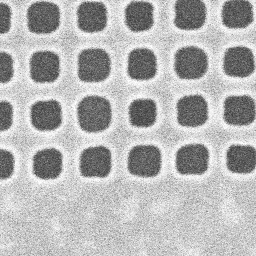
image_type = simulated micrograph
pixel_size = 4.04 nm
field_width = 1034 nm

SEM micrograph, a regular array of holes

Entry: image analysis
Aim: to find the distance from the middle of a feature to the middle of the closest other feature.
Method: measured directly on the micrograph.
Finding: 48.2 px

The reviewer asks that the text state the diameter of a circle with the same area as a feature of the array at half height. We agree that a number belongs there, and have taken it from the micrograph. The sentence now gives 139 nm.